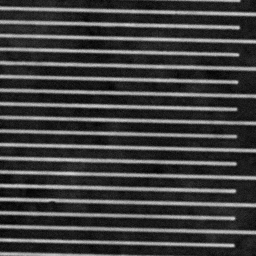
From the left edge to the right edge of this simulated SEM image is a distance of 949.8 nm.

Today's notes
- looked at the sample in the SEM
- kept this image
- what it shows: parallel lines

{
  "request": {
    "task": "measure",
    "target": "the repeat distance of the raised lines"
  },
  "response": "50.6 nanometers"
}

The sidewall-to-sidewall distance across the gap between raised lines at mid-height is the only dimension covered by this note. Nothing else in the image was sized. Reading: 41.7 nm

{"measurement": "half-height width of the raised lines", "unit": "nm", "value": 9.7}